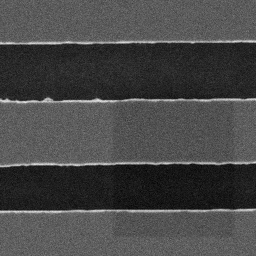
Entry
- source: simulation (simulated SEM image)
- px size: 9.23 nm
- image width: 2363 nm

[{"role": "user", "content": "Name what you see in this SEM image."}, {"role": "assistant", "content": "lines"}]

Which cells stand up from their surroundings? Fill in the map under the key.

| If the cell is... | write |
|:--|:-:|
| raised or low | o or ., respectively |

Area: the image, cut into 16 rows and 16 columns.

oooooooooooooooo
oooooooooooooooo
oooooooooooooooo
................
................
................
oooooooooooooooo
oooooooooooooooo
oooooooooooooooo
oooooooooooooooo
................
................
................
oooooooooooooooo
oooooooooooooooo
oooooooooooooooo